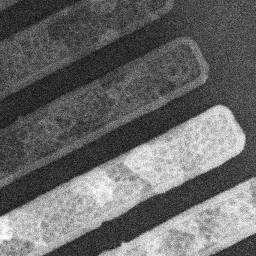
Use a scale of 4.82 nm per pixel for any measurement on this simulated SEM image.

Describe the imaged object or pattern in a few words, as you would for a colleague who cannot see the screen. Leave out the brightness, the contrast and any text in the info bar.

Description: one or a few lines or trenches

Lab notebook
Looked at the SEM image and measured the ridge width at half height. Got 222 nanometers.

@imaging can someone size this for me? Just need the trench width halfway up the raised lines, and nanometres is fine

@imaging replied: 157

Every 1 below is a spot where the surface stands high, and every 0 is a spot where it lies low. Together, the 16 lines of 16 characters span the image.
0000011111000000
0001111110000000
0111111000000000
1111100001110000
1110000111111000
1000011111110000
0001111111000000
0011111100001110
1111110000111110
1111000011111110
1100001111111000
0000111111100000
0011111110000011
0111111000001111
1111100000111111
1110000011111100